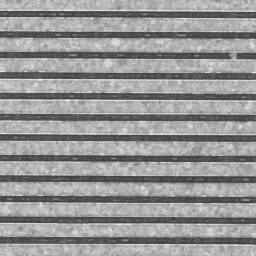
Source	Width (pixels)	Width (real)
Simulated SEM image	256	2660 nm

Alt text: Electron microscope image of parallel lines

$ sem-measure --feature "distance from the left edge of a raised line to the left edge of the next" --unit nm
214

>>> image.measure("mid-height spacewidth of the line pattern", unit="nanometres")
71.4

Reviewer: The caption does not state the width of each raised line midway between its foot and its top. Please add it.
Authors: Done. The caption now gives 142 nm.